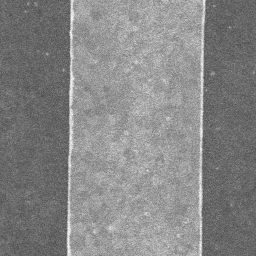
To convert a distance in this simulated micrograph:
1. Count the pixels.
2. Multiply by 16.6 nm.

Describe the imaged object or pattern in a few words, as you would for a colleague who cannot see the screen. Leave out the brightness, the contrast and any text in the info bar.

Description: one or a few lines or trenches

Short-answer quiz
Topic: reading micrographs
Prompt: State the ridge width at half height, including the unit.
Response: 2190 nm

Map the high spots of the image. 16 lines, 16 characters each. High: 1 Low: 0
0000011111111000
0000111111111000
0000111111111000
0000111111111000
0000111111111000
0000111111111000
0000111111111000
0000111111111000
0000111111111000
0000111111111000
0000111111111000
0000111111111000
0000111111111000
0000111111111000
0000111111111000
0000111111111000